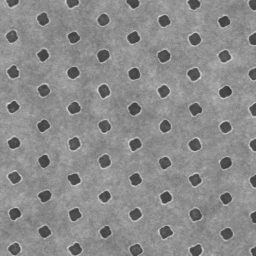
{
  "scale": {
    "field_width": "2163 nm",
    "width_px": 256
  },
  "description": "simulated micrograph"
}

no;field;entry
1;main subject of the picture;a regular array of holes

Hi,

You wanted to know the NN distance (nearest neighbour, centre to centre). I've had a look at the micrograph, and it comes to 34.5 pixels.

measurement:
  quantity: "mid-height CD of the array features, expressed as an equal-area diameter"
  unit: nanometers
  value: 103